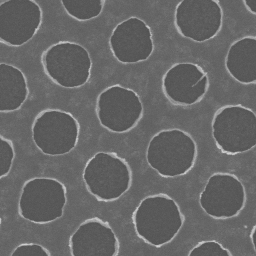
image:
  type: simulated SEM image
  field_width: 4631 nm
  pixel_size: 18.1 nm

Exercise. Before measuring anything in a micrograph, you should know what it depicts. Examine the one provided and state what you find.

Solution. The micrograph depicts a regular array of holes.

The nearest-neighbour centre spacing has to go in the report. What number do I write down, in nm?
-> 1220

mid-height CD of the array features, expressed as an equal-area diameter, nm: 811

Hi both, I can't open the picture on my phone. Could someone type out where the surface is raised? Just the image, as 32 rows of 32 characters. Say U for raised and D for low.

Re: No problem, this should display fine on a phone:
DDDDDUUUDDDDDUUUUUUUUUUDDDDUUUUD
DDDDDUUUUDDDUUUUUUUUUUDDDDDDUUUU
DDDDDUUUUUUUUUUUDUUUUUDDDDDDUUUU
DDDDDUUUUUUUUUUDDDUUUUDDDDDUUUUU
DDDDUUUUUUUUUUDDDDDUUUUDDDDUUUUU
UDDUUUUUDUUUUUDDDDDUUUUUUUUUUDDD
UUUUUUDDDDDUUUDDDDDUUUUUUUUUUDDD
UUUUUDDDDDDUUUUDDDUUUUUUUUUUDDDD
DDUUUUDDDDDUUUUUUUUUUUDDDUUUDDDD
DDDUUUDDDDDUUUUUUUUUUDDDDDUUUDDD
DDDUUUUUDDUUUUUUUUUUUDDDDDUUUUUU
DDDUUUUUUUUUUDDDDUUUUDDDDDUUUUUU
DDDUUUUUUUUUDDDDDUUUUDDDDUUUUUUU
DDUUUUUUUUUUDDDDDDUUUUUUUUUUDDUU
UUUUUDDDDUUUDDDDDDUUUUUUUUUDDDDD
UUUUDDDDDDUUUDDDDUUUUUUUUUUDDDDD
UUUUDDDDDDUUUUUUUUUUDDDUUUUDDDDD
DUUUDDDDDDUUUUUUUUUDDDDDUUUDDDDD
DDUUUDDDDUUUUUUUUUUDDDDDUUUUDDDU
DDUUUUUUUUUUDDUUUUDDDDDDUUUUUUUU
DUUUUUUUUUUDDDDDUUUDDDDDUUUUUUUU
DUUUUUUUUUUDDDDDUUUUDDDUUUUUUUUU
UUUUDDDUUUUDDDDDUUUUUUUUUUDDDDUU
UUUDDDDDUUUDDDDDUUUUUUUUUUDDDDUU
UUUDDDDDUUUUDDDUUUUUUUUUUDDDDDDU
UUDDDDDDUUUUUUUUUUDDDDUUUDDDDDUU
UUUDDDDDUUUUUUUUUDDDDDUUUUDDDDUU
UUUUDDUUUUUUUUUUUDDDDDDUUUUUUUUU
UUUUUUUUUUDDDDUUUDDDDDUUUUUUUUUU
UUUUUUUUUDDDDDUUUUDDDDUUUUUUUUUU
UUUUUUUUUDDDDDDUUUUDUUUUUDDUUUUU
UUDDDDUUUDDDDDUUUUUUUUUUDDDDUUUU